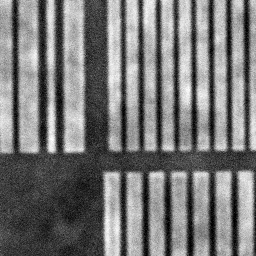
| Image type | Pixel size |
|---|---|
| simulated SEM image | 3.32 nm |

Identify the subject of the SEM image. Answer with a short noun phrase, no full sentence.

groups of lines, slits or small figures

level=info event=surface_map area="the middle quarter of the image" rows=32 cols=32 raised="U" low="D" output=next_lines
UUUUDDDDDDDDUUDDUUDDUUUDDUUDDUUU
UUUUUDDDDDDDUUDDUUDDUUUDDUUDDUUU
UUUUUDDDDDDDUUDDUUDDUUUDDUUDDUUU
UUUUUDDDDDDDUUDDUUDDUUUDDUUDDUUU
UUUUUDDDDDDDUUDDUUDDUUUDDUUDDUUU
UUUUUDDDDDDDUUDDUUDDUUUDDUUDDUUU
UUUUUDDDDDDDUUDDUUDDUUUDDUUDDUUU
UUUUUDDDDDDDUUDDUUDDUUUDDUUDDUUU
UUUUUDDDDDDDUUDDUUDDUUUDDUUDDUUU
UUUUUDDDDDDDUUDDUUDDUUUDDUUDDUUU
UUUUUDDDDDDDUUDDUUDDUUUDDUUDDUUU
UUUUUDDDDDDDUUDDUUDDUUUDDUUDDUUU
UUUUUDDDDDDDUUDDUUDDUUUDDUUDDUUU
UUUUUDDDDDDDUUDDUUDDUUUDDUUDDUUU
UUUUUDDDDDDDUUDDUUDDUUUDDUUDDUUU
UUUUUDDDDDDDUUDDUUDDUUUDDUUDDUUU
UUUUUDDDDDDDUUDDUUDDUUUDDUUDDUUU
UUUUUDDDDDDDUUDDUUDDUUUDDUUDDUUU
UUUUUDDDDDDUUUDDUUDDUUUDDUUDDUUU
UUUUUDDDDDDUUUDDUUDDUUUDDUUDDUUU
UUUUUDDDDDDDUUDDUUDDUUUDDUUDDUUU
UUUUUDDDDDDDUUDDUUDDDDDDDDDDDDDD
DDDDDDDDDDDDDDDDDDDDDDDDDDDDDDDD
DDDDDDDDDDDDDDDDDDDDDDDDDDDDDDDD
DDDDDDDDDDDDDDDDDDDDDDDDDDDDDDDD
DDDDDDDDDDDDDDDDDDDDDDDDDDDDDDDD
DDDDDDDDDDDDDDDDDDDDDDDDDDDDDDDD
DDDDDDDDDDDUUUDDUUUDDDUUUDDUUUDD
DDDDDDDDDDDUUUDDUUUDDDUUUDDUUUDD
DDDDDDDDDDDUUUDDUUUDDDUUUDDUUUDD
DDDDDDDDDDDUUUDDUUUDDDUUUDDUUUDD
DDDDDDDDDDDUUUDDUUUDDDUUUDDUUUDD